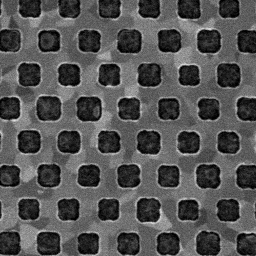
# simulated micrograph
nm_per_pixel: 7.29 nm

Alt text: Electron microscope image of a regular array of holes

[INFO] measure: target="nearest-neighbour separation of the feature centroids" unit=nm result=283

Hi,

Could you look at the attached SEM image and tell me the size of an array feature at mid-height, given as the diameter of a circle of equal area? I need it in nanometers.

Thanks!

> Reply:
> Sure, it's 181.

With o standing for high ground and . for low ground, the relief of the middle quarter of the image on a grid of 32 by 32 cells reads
....ooooo.....ooooo.....ooooo...
....oooo......oooo.......ooo....
....ooooo.....oooo......ooooo...
....ooooo.....oooo......ooooo...
....ooooo.....oooo......ooooo...
...oooooo....oooooo.....oooooo..
oooooooooooooooooooooooooooooooo
oooooooooooooooooooooooooooooooo
oooo.....ooooo....oooooo....oooo
ooo......oooo......ooooo.....ooo
ooo.......ooo......oooo......ooo
ooo.....o.ooo......oooo......ooo
ooo.....o.ooo......oooo......ooo
ooo......ooooo.....ooooo.....ooo
ooooo.o.oooooooooooooooooooooooo
oooooooooooooooooooooooooooooooo
...ooooooooooooooooooooooooooooo
....ooooo.....oooo......ooooo...
....oooo......oooo......oooo....
....oooo......oooo......oooo....
....oooo......oooo......oooo....
....ooooo.....oooo......oooo....
oo.oooooooooooooooo.....oooooo..
oooooooooooooooooooooooooooooooo
oooooooooooooooooooooooooooooooo
oooo....oooooo....oooooo....oooo
ooo......oooo......oooo......ooo
ooo......oooo......oooo......ooo
ooo......oooo......oooo......ooo
ooo......oooo......oooo......ooo
oooo....oooooo....oooooo....oooo
oooooooooooooooooooooooooooooooo